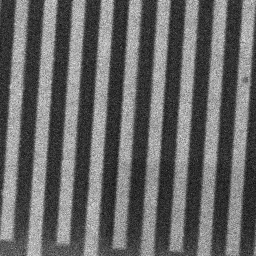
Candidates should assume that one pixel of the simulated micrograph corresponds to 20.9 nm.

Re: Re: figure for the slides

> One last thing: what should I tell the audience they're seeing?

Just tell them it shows parallel lines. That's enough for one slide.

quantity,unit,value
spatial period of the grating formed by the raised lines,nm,592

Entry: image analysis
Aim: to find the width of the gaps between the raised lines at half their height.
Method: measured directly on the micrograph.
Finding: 289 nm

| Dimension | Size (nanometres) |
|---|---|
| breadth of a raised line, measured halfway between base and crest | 292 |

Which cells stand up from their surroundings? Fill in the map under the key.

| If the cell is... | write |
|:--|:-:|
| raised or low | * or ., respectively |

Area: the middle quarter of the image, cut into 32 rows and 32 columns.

.***....***....***....****...***
.***....***....***....****...***
.***....***....***....***....***
.***....***....***....***....***
.***....***....***....***....***
.***....***....***....***....***
.***....***....***....***....***
****....***....***....***....***
****....***....***....***....***
****....***....***....***....***
****...****...****....***....***
****...****...****....***....***
****...****...****....***...****
****...****...****...****...****
****...***....***....****...****
***....***....***....****...****
***....***....***....****...****
***....***....***....***....****
***....***....***....***....****
***....***....***....***....****
***....***....***....***....***.
***....***....***....***....***.
***....***....***....***....***.
***....***....***....***....***.
***....***....***....***....***.
***...****...****....***....***.
***...****...****....***....***.
***...****...****....***...****.
***...****...****...****...****.
***...***....***....****...****.
**....***....***....****...****.
**....***....***....****...****.